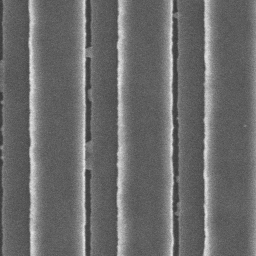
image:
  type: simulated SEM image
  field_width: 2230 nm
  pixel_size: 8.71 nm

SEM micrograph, lines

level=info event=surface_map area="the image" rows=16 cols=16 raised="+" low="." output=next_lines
..+++..++++..+++
..+++..++++..+++
..+++..++++..+++
..+++..++++..+++
..+++..++++..+++
..+++..++++..+++
..+++..++++..+++
..+++..++++..+++
..+++..++++..+++
..+++..++++..+++
..+++..++++..+++
..+++..++++..+++
..+++..++++..+++
..+++..++++..+++
..+++..++++..+++
..+++..++++..+++